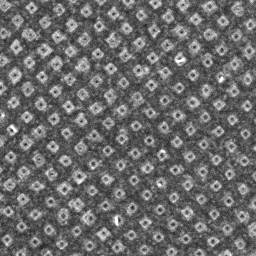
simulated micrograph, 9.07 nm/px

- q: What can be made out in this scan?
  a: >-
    holes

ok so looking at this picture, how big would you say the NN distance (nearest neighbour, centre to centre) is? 130 nm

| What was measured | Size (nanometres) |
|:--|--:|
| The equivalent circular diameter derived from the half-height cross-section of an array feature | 28.9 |